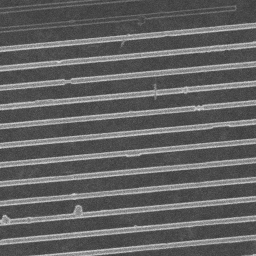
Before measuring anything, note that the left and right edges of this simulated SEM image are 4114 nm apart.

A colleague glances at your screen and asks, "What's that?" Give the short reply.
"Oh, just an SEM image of parallel lines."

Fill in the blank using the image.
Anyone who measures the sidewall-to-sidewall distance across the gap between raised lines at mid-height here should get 234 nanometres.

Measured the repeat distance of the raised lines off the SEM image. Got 308 nanometers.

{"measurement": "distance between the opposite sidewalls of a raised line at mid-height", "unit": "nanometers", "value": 77.9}